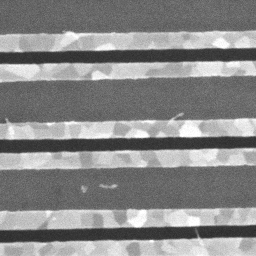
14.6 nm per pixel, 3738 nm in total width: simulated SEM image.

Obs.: lines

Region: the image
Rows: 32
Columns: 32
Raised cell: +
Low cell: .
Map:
................................
................................
................................
................................
++++++++++++++++++++++++++++++++
++++++++++++++++++++++++++++++++
................................
................................
++++++++++++++++++++++++++++++++
++++++++++++++++++++++++++..+...
................................
................................
................................
................................
................................
++++++++++++++++++++++++++++++++
++++++++++++++++++++++++++++++++
................................
................................
++++++++++++++++++++++++++++++++
++++++++++++++++++++++++++++++++
................................
................................
................................
................................
................................
+..+++++++++++++++++++++++++++++
++++++++++++++++++++++++++++++++
++++++++++......................
................................
++++++++++++++++++++++++++++++++
++++++++++++++++++++++++++++++++